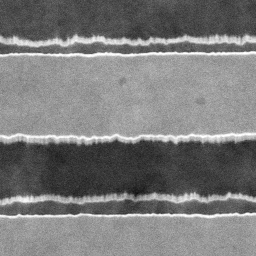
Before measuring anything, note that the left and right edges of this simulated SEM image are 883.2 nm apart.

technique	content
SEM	lines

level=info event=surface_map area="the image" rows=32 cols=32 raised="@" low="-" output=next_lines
--------------------------------
--------------------------------
--------------------------------
--------------------------------
--------------------------------
--------------------------------
---------------------@---------@
@@@@@@@@@@@@@@@@@@@@@@@@@@@@@@@@
@@@@@@@@@@@@@@@@@@@@@@@@@@@@@@@@
@@@@@@@@@@@@@@@@@@@@@@@@@@@@@@@@
@@@@@@@@@@@@@@@@@@@@@@@@@@@@@@@@
@@@@@@@@@@@@@@@@@@@@@@@@@@@@@@@@
@@@@@@@@@@@@@@@@@@@@@@@@@@@@@@@@
@@@@@@@@@@@@@@@@@@@@@@@@@@@@@@@@
@@@@@@@@@@@@@@@@@@@@@@@@@@@@@@@@
@@@@@@@@@@@@@@@@@@@@@@@@@@@@@@@@
@@@@@@@@@@@@@@@@@@@@@@@@@@@@@@@@
--------------------------------
--------------------------------
--------------------------------
--------------------------------
--------------------------------
--------------------------------
--------------------------------
--------------------------------
--------------------------------
--------------------------------
@@@@@@@@@@@@@@@@@@@@@@@@@@@@@@@@
@@@@@@@@@@@@@@@@@@@@@@@@@@@@@@@@
@@@@@@@@@@@@@@@@@@@@@@@@@@@@@@@@
@@@@@@@@@@@@@@@@@@@@@@@@@@@@@@@@
@@@@@@@@@@@@@@@@@@@@@@@@@@@@@@@@